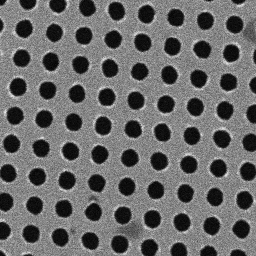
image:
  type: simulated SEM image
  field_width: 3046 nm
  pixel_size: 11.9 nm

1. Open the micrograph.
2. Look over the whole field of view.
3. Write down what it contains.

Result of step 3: a regular array of holes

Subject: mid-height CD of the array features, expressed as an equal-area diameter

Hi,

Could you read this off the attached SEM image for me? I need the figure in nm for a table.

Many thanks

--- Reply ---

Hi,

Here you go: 213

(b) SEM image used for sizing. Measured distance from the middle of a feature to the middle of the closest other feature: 0.343 um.